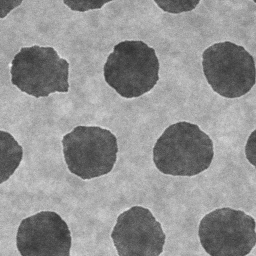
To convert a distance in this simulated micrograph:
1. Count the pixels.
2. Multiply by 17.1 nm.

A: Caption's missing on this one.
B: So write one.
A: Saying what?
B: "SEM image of holes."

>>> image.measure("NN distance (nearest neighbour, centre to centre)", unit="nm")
1580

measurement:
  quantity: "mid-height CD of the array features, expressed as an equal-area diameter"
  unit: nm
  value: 955